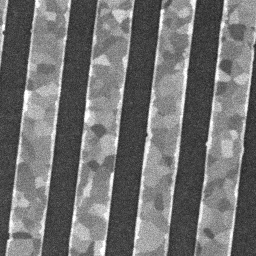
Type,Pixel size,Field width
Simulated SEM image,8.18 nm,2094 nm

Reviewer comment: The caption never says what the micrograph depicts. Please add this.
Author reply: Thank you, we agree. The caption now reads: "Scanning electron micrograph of one or a few lines or trenches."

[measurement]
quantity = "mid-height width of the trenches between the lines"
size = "232 nm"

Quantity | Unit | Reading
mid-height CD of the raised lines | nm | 279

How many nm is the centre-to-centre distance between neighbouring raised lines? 512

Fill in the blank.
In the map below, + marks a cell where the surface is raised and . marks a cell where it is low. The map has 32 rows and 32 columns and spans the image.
+...+++++...+++++...++++....++++
+...+++++...++++....++++....++++
+...+++++...++++....++++....++++
....++++....++++....++++....++++
....++++....++++....++++....++++
....++++....++++....++++...+++++
....++++....++++....++++...+++++
....++++...+++++....++++...+++++
....++++...+++++...++++....++++.
...+++++...+++++...++++....++++.
...+++++...+++++...++++....++++.
...++++....++++....++++....++++.
...++++....++++....++++....++++.
...++++....++++....++++....++++.
...++++....++++....++++...+++++.
...++++....++++....++++...+++++.
...++++...+++++....++++...++++..
..+++++...+++++...+++++...++++..
..+++++...+++++...++++....++++..
..+++++...++++....++++....++++..
..++++....++++....++++....++++..
..++++....++++....++++....++++..
..++++....++++....++++....++++..
..++++....++++....++++...+++++..
..++++....++++....++++...+++++..
..++++...+++++...++++....+++++..
.+++++...+++++...++++....++++...
.+++++...++++....++++....++++...
.++++....++++....++++....++++...
.++++....++++....++++....++++...
.++++....++++....++++....++++...
.++++....++++....++++...+++++...